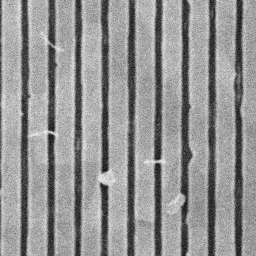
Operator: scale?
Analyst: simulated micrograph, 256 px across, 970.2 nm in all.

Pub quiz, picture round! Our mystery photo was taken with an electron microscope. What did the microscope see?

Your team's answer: parallel lines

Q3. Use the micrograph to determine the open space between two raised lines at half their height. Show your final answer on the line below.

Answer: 31.7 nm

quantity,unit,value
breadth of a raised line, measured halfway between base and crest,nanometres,69.6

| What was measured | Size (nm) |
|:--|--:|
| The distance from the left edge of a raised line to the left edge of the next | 101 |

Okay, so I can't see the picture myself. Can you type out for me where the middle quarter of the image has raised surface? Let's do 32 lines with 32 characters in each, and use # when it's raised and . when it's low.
###..####..#####..#####..####...
###.#####..#####..#####..####...
##..#####..#####..####...####...
##...####..#####..####...####...
##...####..#####..####...####...
##...####..#####..####...####...
##...####..#####..####...####...
##...####..#####..####...####...
##...####..#####..####...####...
###..####..#####..####...####...
###..####..#####..####...####...
###..####..#####..####...####...
###..####..#####..####...####...
##...####..#####..####...####...
##...####..#####..####...####...
##...####..#####..####...####...
##...####..#####..####...####...
##...####..#####..####...####...
##...####..#####..####...####..#
##...####..#####..####...####..#
##...####..#####..####...####..#
##...####..#####..####...####...
##...####..#####..####...####...
##...####..#####..####...####...
##...####..#####..###########...
##...####..#####..####...####..#
##...####..#####..####...####..#
##...##########...####...####..#
##...##########...####...####..#
##...###########..####...####..#
##...####..#####..####...####..#
##...####..#####..####...####..#